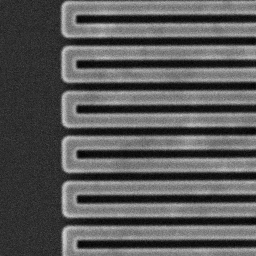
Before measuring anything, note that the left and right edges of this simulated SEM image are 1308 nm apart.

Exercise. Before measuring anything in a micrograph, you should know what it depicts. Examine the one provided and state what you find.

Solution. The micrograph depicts groups of lines, slits or small figures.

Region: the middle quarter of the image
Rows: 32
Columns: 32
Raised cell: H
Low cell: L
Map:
HHHLLLLLLLLLLLLLLLLLLLLLLLLLLLLL
HHHHHHHHHHHHHHHHHHHHHHHHHHHHHHHH
HHHHHHHHHHHHHHHHHHHHHHHHHHHHHHHH
HHHHHHHHHHHHHHHHHHHHHHHHHHHHHHHH
LHHHHHHHHHHHHHHHHHHHHHHHHHHHLLLL
LLLLLLLLLLLLLLLLLLLLLLLLLLLLLLLL
LLLLLLLLLLLLLLLLLLLLLLLLLLLLLLLL
HHHHHHHHHHHHHHHHHHHHHHHHHHHHHHHH
HHHHHHHHHHHHHHHHHHHHHHHHHHHHHHHH
HHHHHHHHHHHHHHHHHHHHHHHHHHHHHHHH
HHHLLLLLLLLLLLLLLLLLLLLLLLLLLLLL
HHHLLLLLLLLLLLLLLLLLLLLLLLLLLLLL
HHHHHHHHHHHHHHHHHHHHHHHHHHHHHHHH
HHHHHHHHHHHHHHHHHHHHHHHHHHHHHHHH
HHHHHHHHHHHHHHHHHHHHHHHHHHHHHHHH
LHHHHHHHHHHHHHHHHHHHHHHHHHHHHHHH
LLLLLLLLLLLLLLLLLLLLLLLLLLLLLLLL
LLLLLLLLLLLLLLLLLLLLLLLLLLLLLLLL
HHHHHHHHHHHHHHHHHHHHHHHHHHHHHHHH
HHHHHHHHHHHHHHHHHHHHHHHHHHHHHHHH
HHHHHHHHHHHHHHHHHHHHHHHHHHHHHHHH
HHHHLLLLLLLLLLLLLLLLLLLLLLLLLLLL
HHHLLLLLLLLLLLLLLLLLLLLLLLLLLLLL
HHHLLLLLLLLLLLLLLLLLLLLLLLLLLLLL
HHHHHHHHHHHHHHHHHHHHHHHHHHHHHHHH
HHHHHHHHHHHHHHHHHHHHHHHHHHHHHHHH
HHHHHHHHHHHHHHHHHHHHHHHHHHHHHHHH
LLLLLLLLLLLLLLLLLLLLLLLLLLLLLLLL
LLLLLLLLLLLLLLLLLLLLLLLLLLLLLLLL
LHHHHHHHHHHHHHHHHHHHHHHHHHHHHHHH
HHHHHHHHHHHHHHHHHHHHHHHHHHHHHHHH
HHHHHHHHHHHHHHHHHHHHHHHHHHHHHHHH